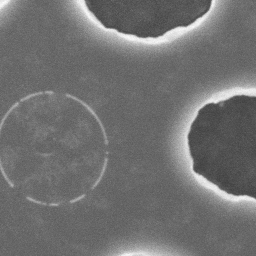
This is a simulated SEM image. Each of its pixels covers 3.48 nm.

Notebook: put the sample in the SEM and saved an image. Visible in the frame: holes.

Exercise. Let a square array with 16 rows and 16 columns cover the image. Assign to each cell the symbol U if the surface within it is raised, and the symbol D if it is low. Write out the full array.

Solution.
UUUUUDDDDDDDDUUU
UUUUUUDDDDDDUUUU
UUUUUUUUUUUUUUUU
UUUUUUUUUUUUUUUU
UUUUUUUUUUUUUUUU
UUUUUUUUUUUUUUUU
UUUUUUUUUUUUUDDD
UUUUUUUUUUUUDDDD
UUUUUUUUUUUUDDDD
UUUUUUUUUUUUDDDD
UUUUUUUUUUUUDDDD
UUUUUUUUUUUUUDDD
UUUUUUUUUUUUUUUU
UUUUUUUUUUUUUUUU
UUUUUUUUUUUUUUUU
UUUUUUUUUUUUUUUU